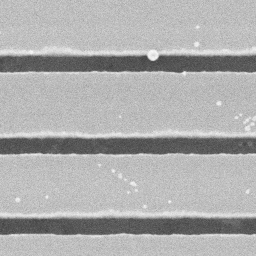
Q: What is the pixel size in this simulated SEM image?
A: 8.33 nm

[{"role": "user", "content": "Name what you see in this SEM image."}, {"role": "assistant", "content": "lines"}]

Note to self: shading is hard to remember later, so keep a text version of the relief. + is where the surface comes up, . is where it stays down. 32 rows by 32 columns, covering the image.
++++++++++++++++++++++++++++++++
++++++++++++++++++++++++++++++++
++++++++++++++++++++++++++++++++
++++++++++++++++++++++++++++++++
++++++++++++++++++++++++++++++++
++++++++++++++++++++++++++++++++
++++++++++++++++++++++++++++++++
................................
................................
++++++++++++++++++++++++++++++++
++++++++++++++++++++++++++++++++
++++++++++++++++++++++++++++++++
++++++++++++++++++++++++++++++++
++++++++++++++++++++++++++++++++
++++++++++++++++++++++++++++++++
++++++++++++++++++++++++++++++++
++++++++++++++++++++++++++++++++
................................
................................
++++++++++++++++++++++++++++++++
++++++++++++++++++++++++++++++++
++++++++++++++++++++++++++++++++
++++++++++++++++++++++++++++++++
++++++++++++++++++++++++++++++++
++++++++++++++++++++++++++++++++
++++++++++++++++++++++++++++++++
++++++++++++++++++++++++++++++++
................................
................................
++++++++++++++++++++++++++++++++
++++++++++++++++++++++++++++++++
++++++++++++++++++++++++++++++++